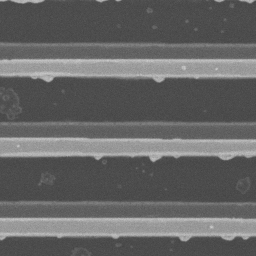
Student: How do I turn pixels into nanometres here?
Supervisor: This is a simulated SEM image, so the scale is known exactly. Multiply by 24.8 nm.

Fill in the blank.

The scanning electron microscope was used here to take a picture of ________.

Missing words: lines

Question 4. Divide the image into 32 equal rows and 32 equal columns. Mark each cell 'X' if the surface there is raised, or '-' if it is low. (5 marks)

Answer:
--------------------------------
--------------------------------
--------------------------------
--------------------------------
--------------------------------
--------------------------------
XXXXXXXXXXXXXXXXXXXXXXXXXXXXXXXX
XXXXXXXXXXXXXXXXXXXXXXXXXXXXXXXX
XXXXXXXXXXXXXXXXXXXXXXXXXXXXXXXX
--X-XXX--------XXXXXXXXXXXXXXXXX
--------------------------------
--------------------------------
--------------------------------
--------------------------------
--------------------------------
--------------------------------
XXXXXXXXXXXXXXXXXXXXXXXXXXXXXXXX
XXXXXXXXXXXXXXXXXXXXXXXXXXXXXXXX
XXXXXXXXXXXXXXXXXXXXXXXXXXXXXXXX
XXXXXXXXX-XXX---X-XXXXX----XXXXX
--------------------------------
--------------------------------
--------------------------------
--------------------------------
--------------------------------
--XXXX--------------------------
XXXXXXXXXXXXXXXXXXXXXXXXXXXXXXXX
XXXXXXXXXXXXXXXXXXXXXXXXXXXXXXXX
XXXXXXXXXXXXXXXXXXXXXXXXXXXXXXXX
X------X------X-------XX---XXXXX
--------------------------------
--------------------------------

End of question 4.